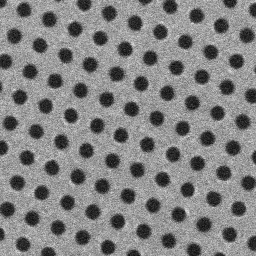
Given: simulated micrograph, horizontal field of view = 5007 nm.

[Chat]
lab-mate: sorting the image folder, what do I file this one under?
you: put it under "a regular array of holes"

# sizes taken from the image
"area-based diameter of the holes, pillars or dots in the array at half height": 318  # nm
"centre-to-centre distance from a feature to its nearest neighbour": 522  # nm